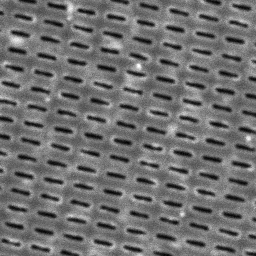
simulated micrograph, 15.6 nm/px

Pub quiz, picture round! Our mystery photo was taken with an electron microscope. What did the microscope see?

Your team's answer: a regular array of holes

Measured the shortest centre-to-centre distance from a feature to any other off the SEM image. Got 265 nm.